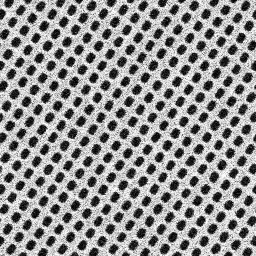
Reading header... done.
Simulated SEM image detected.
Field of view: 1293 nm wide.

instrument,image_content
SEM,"a regular array of holes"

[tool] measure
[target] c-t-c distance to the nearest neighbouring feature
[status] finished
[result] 0.0708 um